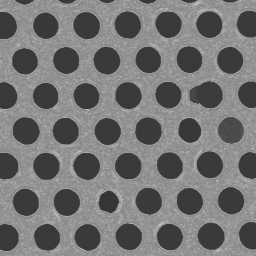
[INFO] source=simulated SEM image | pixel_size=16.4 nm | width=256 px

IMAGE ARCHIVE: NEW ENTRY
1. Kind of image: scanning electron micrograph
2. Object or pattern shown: a regular array of holes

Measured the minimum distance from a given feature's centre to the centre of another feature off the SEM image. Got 661 nm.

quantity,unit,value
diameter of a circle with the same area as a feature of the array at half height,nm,436